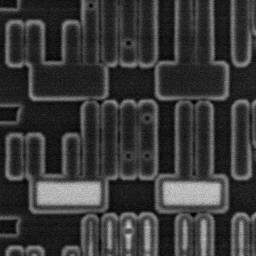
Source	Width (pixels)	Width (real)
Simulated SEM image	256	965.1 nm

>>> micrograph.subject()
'wiring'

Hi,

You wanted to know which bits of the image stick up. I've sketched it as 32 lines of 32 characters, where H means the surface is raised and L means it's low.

LLLLLLLLLLHHHHHHHHHHLLHHHHLLLHHH
LLLLLLLLLLHHHHHHHHHHLLHHHHLLLHHH
LLLLLLLLLLHHHHHHHHHHLLHHHHHLLHHH
LHHHHLLLHHHHHHHHHHHHLLHHHHHLLHHH
LHHHHLLLHHHHHHHHHHHHLLHHHHHLLHHL
LHHHHLLLHHHHHHHHHHHHLLHHHHHLLHHL
LHHHHLLLHHHHHHHHHHHHLLHHHHHLLHHL
LHHHHHLLHHHHHHHHHHHHLLHHHHHLLHHL
LLLLHHHHHHHHHHLLLLLHHHHHHHHHLLLL
LLLLHHHHHHHHHLLLLLLLHHHHHHHHLLLL
LLLLHHHHHHHHHLLLLLLLHHHHHHHHLLLL
LLLLHHHHHHHHHLLLLLLLHHHHHHHHLLLL
LLLLLLLLLLHHLHLLLLLLLLHHHHLLLLLL
LLLLLLLLLLHHHHHHHHHHLLHHHHLLLHHH
LLLLLLLLLLHHHHHHHHHHLLHHHHLLLHHH
LLLLLLLLLLHHHHHHHHHHLLHHHHLLLHHH
LLLLLLLLLLHHHHHHHHHHLLHHHHLLLHHH
LHHHHLLLHHHHHHHHHHHHLLHHHHLLLHHH
LHHHHLLLHHHHHHHHHHHHLLHHHHLLLHHL
LHHHHLLLHHHHHHHHHHHHLLHHHHLLLHHL
LHHHHLLLHHHHHHHHHHHHLLHHHHLLLHHL
LHHHHHLLHHHHHHHHHHHHLLHHHHHLLHHL
LLLLHHHHHHHHHHLLLLLHHHHHHHHHLLLL
LLLLHHHHHHHHHLLLLLLLHHHHHHHHLLLL
LLLLHHHHHHHHHLLLLLLLHHHHHHHHLLLL
LLLLHHHHHHHHHLLLLLLLHHHHHHHHLLLL
LLLLHHHHLLHHLLLLLLLLLLHHHHHLLLLL
LLLLLLLLLLHHHHHHHHHHLLHHHHHLLHHH
LLLLLLLLLLHHHHHHHHHHLLHHHHHLLHHH
LLLLLLLLLLHHHHHHHHHHLLHHHHHLLHHH
LLLLLLLLLLHHHHHHHHHHLLHHHHHLLHHH
LHHHHLLLHHHHHHHHHHHHLLHHHHHLLHHH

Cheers